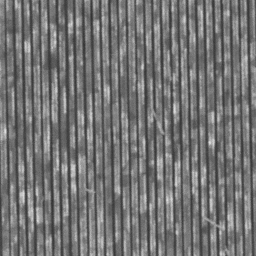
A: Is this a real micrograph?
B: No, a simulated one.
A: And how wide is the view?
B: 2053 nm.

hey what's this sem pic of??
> parallel lines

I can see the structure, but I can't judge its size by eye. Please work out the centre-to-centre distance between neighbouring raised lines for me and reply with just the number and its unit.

69.5 nanometers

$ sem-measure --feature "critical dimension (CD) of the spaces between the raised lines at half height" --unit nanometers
27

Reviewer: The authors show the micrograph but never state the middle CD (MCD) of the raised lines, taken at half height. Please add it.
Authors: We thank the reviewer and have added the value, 0.0411 micrometres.